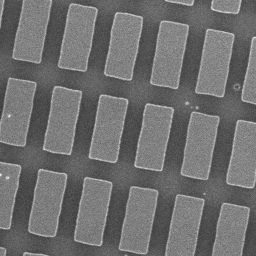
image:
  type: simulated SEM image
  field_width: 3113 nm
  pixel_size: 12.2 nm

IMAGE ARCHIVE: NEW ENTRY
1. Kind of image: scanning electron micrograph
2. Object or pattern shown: groups of lines, slits or small figures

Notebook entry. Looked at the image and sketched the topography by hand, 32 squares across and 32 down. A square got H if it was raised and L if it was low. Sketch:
LLLHHHLLLLLLLLLLLLLLLLLHLLHHHHLL
LLLHHHLLLHHHLLLLLLLLLLLLLLLLHHLL
LLLHHHLLHHHHLLHHHHLLLLLLLLLLLLLL
LLHHHHLLHHHHLLHHHHLLHHHLLLLLLLLL
LLHHHHLLHHHHLLHHHLLLHHHLLLHHHLLL
LLHHHLLLHHHLLLHHHLLLHHHLLHHHHLLH
LLHHHLLLHHHLLLHHHLLHHHHLLHHHHLLH
LLHHHLLHHHHLLHHHHLLHHHHLLHHHHLLH
LLLLLLLLHHHLLHHHHLLHHHHLLHHHHLLH
LLLLLLLLLLLLLLHHHLLHHHLLLHHHLLLH
LHHHLLLLLLLLLLLLLLLHHHLLLHHHLLHH
LHHHLLLHHHLLLLLLLLLLLLLLLHHHLLHH
LHHHLLHHHHLLHHHHLLLLLLLLLLLLLLHH
HHHHLLHHHHLLHHHHLLHHHLLLLLLLLLLL
HHHHLLHHHHLLHHHHLLHHHHLLHHHLLLLL
HHHHLLHHHHLLHHHLLLHHHLLLHHHLLLHH
HHHLLLHHHLLLHHHLLLHHHLLHHHHLLHHH
HHHLLLHHHLLLHHHLLHHHHLLHHHHLLHHH
LLLLLLHHHLLHHHHLLHHHHLLHHHHLLHHH
LLLLLLLLLLLHHHHLLHHHHLLHHHHLLHHH
HHLLLLLLLLLLLLLLLHHHLLLHHHLLLHHH
HHLLLHHLLLLLLLLLLLLLLLLHHHLLHHHH
HHLLLHHHLLLHLLLLLLLLLLLLLLLLHHHH
HHLLHHHHLLHHHHLLHHLLLLLLLLLLLLLL
HHLLHHHHLLHHHHLLHHHHLLHLLLLLLLLL
HHLLHHHHLLHHHHLLHHHHLLHHHLLLHLLL
HHLLHHHHLLHHHLLLHHHLLLHHHLLLHHHL
HLLLHHHLLLHHHLLLHHHLLHHHHLLHHHHL
HLLLHHHLLHHHHLLHHHHLLHHHHLLHHHHL
LLLLLHHLLHHHHLLHHHHLLHHHHLLHHHHL
LLLLLLLLLLLHLLLHHHHLLHHHHLLHHHLL
HLLLLLLLLLLLLLLLHHLLLHHHLLLHHHLL